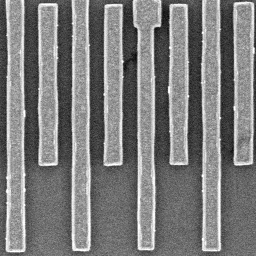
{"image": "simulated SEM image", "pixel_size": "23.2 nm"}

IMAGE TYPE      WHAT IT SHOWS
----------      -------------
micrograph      wiring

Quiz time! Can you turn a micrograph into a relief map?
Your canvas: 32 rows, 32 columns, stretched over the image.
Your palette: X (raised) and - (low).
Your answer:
-XX------XX------XXX-----XX---X-
-XX--XX--XX--XX--XXX-XX--XX--XXX
-XX--XX--XX--XX--XXX-XX--XX--XXX
-XX--XX--XX--XX--XX--XX--XX--XXX
-XX--XX--XX--XX--XX--XX--XX--XXX
-XX--XX--XX--XX--XX--XX--XX--XXX
-XX--XX--XX--XX--XX--XX--XX--XXX
-XX--XX--XX--XX--XX--XX--XX--XXX
-XX--XX--XX--XX--XX--XX--XXX-XXX
-XX--XX--XX--XX--XX--XX--XXX-XXX
-XX--XX--XX--XX--XX--XX--XX--XXX
-XX--XX--XX--XX--XX--XX--XX--XXX
-XX--XX--XX--XX--XX--XX--XX--XXX
-XX--XX--XX--XX--XX--XX--XX--XXX
-XX--XX--XX--XX--XX--XX--XX--XXX
-XX--XX--XX--XX--XX--XX--XX--XXX
-XX--XX--XX--XX--XX--XX--XX--XXX
-XX--XX--XX--XX--XX--XX--XX--XX-
-XX--XX--XX--XX--XX--XX--XX--XX-
-XX--XX--XX--XX--XX--XX--XXX-XX-
-XX--XX--XX--XX--XX---X--XXX--X-
-XX------XX------XX------XXX----
-XX------XX------XX------XXX----
-XX------XX------XX------XX-----
-XX------XX------XX------XX-----
-XX------XX------XX------XX-----
-XX------XX------XX------XX-----
-XX------XX------XX------XX-----
-XX------XX------XX------XX-----
-XX------XX------XX------XX-----
-XX------XX------XX------XXX----
--------------------------------